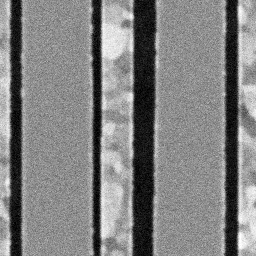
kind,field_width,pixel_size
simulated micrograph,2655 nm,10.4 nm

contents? lines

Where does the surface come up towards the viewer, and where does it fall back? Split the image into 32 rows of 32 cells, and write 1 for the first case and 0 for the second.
10011111111001110000111111110011
10011111111001110000111111110011
10011111111001110000111111110011
10011111111001110000111111110011
10011111111001110000111111110011
10011111111001110000111111110011
10011111111001110000111111110011
10011111111001110000111111110011
10011111111001110000111111110011
10011111111001110000111111110011
10011111111001110000111111110011
10011111111001110000111111110011
10011111111001110000111111110011
10011111111001110001111111110011
10011111111001110001111111110011
10011111111001110001111111110011
10011111111001110001111111110011
10011111111001110001111111110011
10011111111001110001111111110011
10011111111001110001111111110011
10011111111001110001111111110011
10011111111001110001111111110011
10011111111001110001111111110011
10011111111001110001111111110011
10011111111001110001111111110011
10011111111001110001111111110011
10011111111001110001111111110011
10011111111001110001111111110011
10011111111101110001111111110011
10011111111101110001111111110011
10011111111001110001111111110011
10011111111101110001111111110011